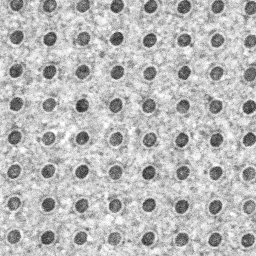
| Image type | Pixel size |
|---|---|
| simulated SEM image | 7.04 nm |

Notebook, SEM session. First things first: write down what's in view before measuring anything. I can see a regular array of holes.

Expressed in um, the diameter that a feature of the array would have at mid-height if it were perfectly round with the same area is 0.108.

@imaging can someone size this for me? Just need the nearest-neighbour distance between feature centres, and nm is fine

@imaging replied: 230